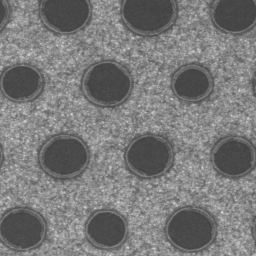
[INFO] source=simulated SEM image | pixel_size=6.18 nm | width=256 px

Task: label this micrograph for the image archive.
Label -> a regular array of raised bodies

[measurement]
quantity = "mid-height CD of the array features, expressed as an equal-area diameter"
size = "258 nm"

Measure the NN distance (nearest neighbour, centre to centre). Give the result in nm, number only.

520